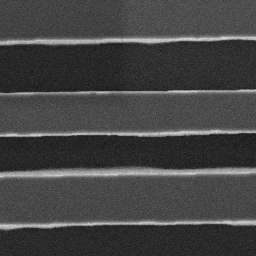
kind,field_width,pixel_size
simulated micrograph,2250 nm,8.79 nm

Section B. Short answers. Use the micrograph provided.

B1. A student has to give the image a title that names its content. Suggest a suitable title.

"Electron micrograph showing lines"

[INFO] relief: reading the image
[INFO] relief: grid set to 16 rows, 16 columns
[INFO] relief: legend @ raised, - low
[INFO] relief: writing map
@@@@@@@@@@@@@@@@
@@@@@@@@@@@@@@@@
@@@@@@@@--------
----------------
----------------
----------------
@@@@@@@@@@@@@@@@
@@@@@@@@@@@@@@@@
----------------
----------------
----------------
@@@@@@@@@@@@@@@@
@@@@@@@@@@@@@@@@
@@@@@@@@@@@@@@@@
----------------
----------------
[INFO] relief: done